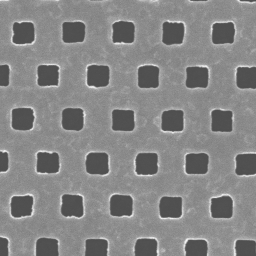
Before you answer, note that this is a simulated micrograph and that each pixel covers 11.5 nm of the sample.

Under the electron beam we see a regular array of holes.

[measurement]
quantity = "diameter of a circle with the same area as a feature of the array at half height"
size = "278 nm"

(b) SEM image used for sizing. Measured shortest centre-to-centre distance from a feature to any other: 567 nanometers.